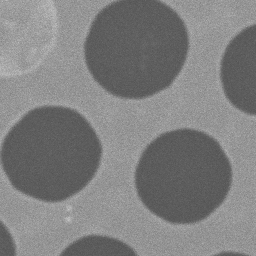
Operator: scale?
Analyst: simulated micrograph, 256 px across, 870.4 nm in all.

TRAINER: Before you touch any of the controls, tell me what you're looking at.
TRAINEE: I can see holes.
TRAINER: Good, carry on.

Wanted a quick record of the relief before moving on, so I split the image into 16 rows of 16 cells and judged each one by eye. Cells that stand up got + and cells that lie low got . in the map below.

++++++.....+++++
++++++......++++
+++++.......++..
+++++.......++..
++++++.....+++..
++++++....++++..
++++++++++++++..
+....+++++++++++
......++++...+++
......+++.....++
......++......++
+.....++......++
++..+++++.....++
++++++++++...+++
.+++++++++++++++
.+++....++++++++